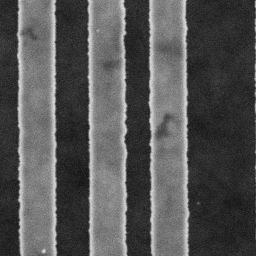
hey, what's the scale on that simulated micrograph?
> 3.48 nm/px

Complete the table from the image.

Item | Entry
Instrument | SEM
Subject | lines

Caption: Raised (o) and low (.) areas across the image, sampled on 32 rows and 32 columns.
..ooooo....oooo....oooo.........
..ooooo....ooooo...oooo.........
..ooooo....ooooo...oooo.........
..ooooo....ooooo...oooo.........
..ooooo....ooooo...oooo.........
..ooooo....oooo....oooo.........
..ooooo....ooooo...oooo.........
..ooooo....ooooo...oooo.........
..ooooo....ooooo...oooo.........
..ooooo....ooooo...oooo.........
..ooooo....ooooo...oooo.........
..ooooo....ooooo...oooo.........
..ooooo....ooooo...oooo.........
..ooooo....ooooo...oooo.........
..ooooo....ooooo...oooo.........
..ooooo....ooooo...oooo.........
..ooooo....ooooo...oooo.........
..ooooo....ooooo...oooo.........
..ooooo....ooooo...oooo.........
..ooooo....ooooo...oooo.........
..ooooo....ooooo...oooo.........
..ooooo....ooooo...oooo.........
..ooooo....ooooo...oooo.........
..ooooo....ooooo...oooo.........
..ooooo....ooooo...oooo.........
..ooooo....ooooo...oooo.........
..ooooo....ooooo...ooooo........
..ooooo....ooooo...oooo.........
..ooooo....ooooo...oooo.........
..ooooo....ooooo...oooo.........
..ooooo....ooooo...oooo.........
...oooo....ooooo...oooo.........